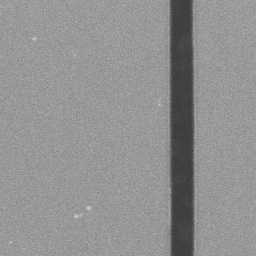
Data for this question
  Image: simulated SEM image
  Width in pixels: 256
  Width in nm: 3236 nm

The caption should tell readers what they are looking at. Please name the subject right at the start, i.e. one or a few lines or trenches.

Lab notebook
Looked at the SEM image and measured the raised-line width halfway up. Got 329 nm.